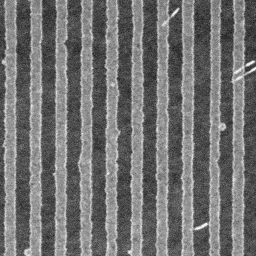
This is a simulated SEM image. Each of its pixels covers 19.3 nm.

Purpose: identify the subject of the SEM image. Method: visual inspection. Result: parallel lines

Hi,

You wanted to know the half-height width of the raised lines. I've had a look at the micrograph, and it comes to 0.19 µm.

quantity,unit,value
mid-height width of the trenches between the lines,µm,0.296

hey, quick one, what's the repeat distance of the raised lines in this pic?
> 489 nm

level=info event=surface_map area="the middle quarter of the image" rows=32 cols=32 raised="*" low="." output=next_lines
*....**...***....**.....**....**
*...***....**....**.....**....**
.....**....**....***...***....**
*...***....**....***....**....**
*...***....**....***....**....**
*...***....**....***...***....**
*....**....**....***...***....**
.....**....***...***...***....**
.....**....**....***....**....**
....***....**....***....**....**
....***....**....***...***....**
....***....**....**.....**....**
....***....**....***...***....**
.....**....**....***...***....**
*....**....**....***...***....**
.....**....**....***...***....**
.....**....***...***...***....**
*....**....***...***...***....**
....***....**....***...***....**
.....**....**....***...***....**
*....**....**....***...***....**
*....**....**....***...***....**
*...***....**....***...***....**
*...***....**....***...***....**
....***....**....***...***....**
....***....**....**....***....**
....***....**....**....***....**
*...***....**....**....***....**
....***....**....***...***....**
....***....**....**....***....**
....***....**....**....***....**
....***...***....**.....**....**